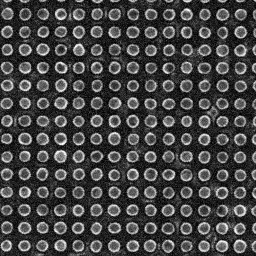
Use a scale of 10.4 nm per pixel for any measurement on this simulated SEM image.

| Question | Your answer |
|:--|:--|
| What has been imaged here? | a regular array of raised bodies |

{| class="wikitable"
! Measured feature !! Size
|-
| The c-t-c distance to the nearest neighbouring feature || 184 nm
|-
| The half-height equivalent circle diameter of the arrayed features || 114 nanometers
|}